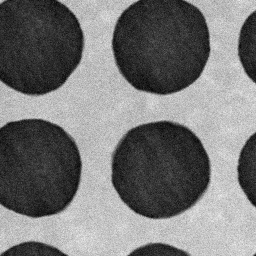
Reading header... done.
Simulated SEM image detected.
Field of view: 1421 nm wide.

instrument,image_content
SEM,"holes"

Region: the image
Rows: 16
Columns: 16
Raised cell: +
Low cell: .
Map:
....++++....++++
.....++......++.
.....++......++.
.....++......++.
.....+++.....++.
+...+++++...++++
++++++++++++++++
+..+++++++++++++
....++++....++++
.....++......++.
.....++......++.
.....++......++.
.....+++....++++
++.++++++..+++++
++++++++++++++++
+...+++++..+++++